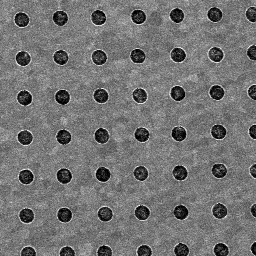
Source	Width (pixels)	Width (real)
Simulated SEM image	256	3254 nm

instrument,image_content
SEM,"a regular array of holes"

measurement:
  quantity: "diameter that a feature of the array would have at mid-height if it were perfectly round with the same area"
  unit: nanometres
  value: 194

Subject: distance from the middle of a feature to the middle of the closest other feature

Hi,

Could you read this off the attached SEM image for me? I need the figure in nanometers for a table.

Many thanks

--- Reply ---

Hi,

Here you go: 483